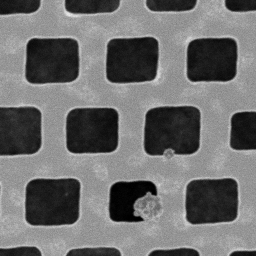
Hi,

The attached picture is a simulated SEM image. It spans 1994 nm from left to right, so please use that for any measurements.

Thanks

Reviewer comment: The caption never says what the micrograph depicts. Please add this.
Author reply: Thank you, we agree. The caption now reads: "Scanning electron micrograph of a regular array of holes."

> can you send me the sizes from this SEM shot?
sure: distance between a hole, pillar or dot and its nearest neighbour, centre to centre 620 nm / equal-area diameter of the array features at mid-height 416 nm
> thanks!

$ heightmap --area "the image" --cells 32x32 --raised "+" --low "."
.....+++.......+++.......+++....
....+++++.....++++++++++++++++++
++++++++++++++++++++++++++++++++
++++++++++++++++++++++++++++++++
++++++++++++++++++++++++++++++++
+++.......+++.......++++......++
+++.......+++.......+++.......++
+++.......+++.......+++.......++
+++.......+++.......+++.......++
+++.......+++......++++......+++
++++++++++++++++++++++++++++++++
++++++++++++++++++++++++++++++++
++++++++++++++++++++++++++++++++
....++++++.++.+++++......+++++++
.....+++.......+++.......++++...
.....+++.......+++.......++++...
.....+++.......+++.......++++...
.....+++.......+++.......++++...
.....+++.......+++.......++++...
++++++++++++++++++++++++++++++++
++++++++++++++++++++++++++++++++
++++++++++++++++++++++++++++++++
++++......++++++++++++++.....+++
+++.......++++......+++.......++
+++.......++++....+++++.......++
+++.......++++...++++++.......++
+++.......++++...++++++.......++
+++.......++++....+++++......+++
++++++++++++++++++++++++++++++++
++++++++++++++++++++++++++++++++
++++++++++++++++++++++++++++++++
.....++++......++++......+++++..